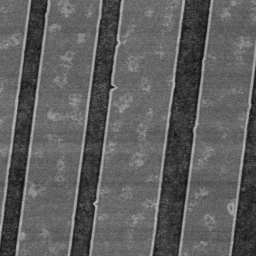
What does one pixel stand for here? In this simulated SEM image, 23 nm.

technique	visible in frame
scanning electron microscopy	one or a few lines or trenches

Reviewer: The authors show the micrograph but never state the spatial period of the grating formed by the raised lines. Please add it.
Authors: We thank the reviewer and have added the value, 1830 nanometers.